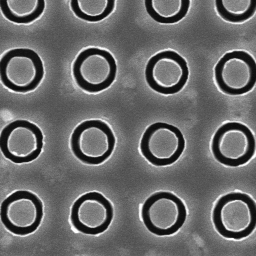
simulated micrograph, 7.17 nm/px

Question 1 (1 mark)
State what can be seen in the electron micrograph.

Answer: ring-shaped grooves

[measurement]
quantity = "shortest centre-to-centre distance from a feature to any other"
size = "70.9 pixels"